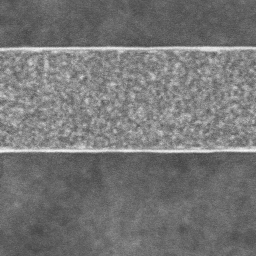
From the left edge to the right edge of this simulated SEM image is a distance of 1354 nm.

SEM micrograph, one or a few lines or trenches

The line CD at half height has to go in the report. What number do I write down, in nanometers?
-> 545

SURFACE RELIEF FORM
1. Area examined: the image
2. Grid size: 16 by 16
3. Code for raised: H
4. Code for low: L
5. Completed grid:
LLLLLLLLLLLLLLLL
LLLLLLLLLLLLLLLL
LLLLLLLLLLLLLLLL
HHHHHHHHHHHHHHHH
HHHHHHHHHHHHHHHH
HHHHHHHHHHHHHHHH
HHHHHHHHHHHHHHHH
HHHHHHHHHHHHHHHH
HHHHHHHHHHHHHHHH
LLLLLLLLLLLLLLLL
LLLLLLLLLLLLLLLL
LLLLLLLLLLLLLLLL
LLLLLLLLLLLLLLLL
LLLLLLLLLLLLLLLL
LLLLLLLLLLLLLLLL
LLLLLLLLLLLLLLLL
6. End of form